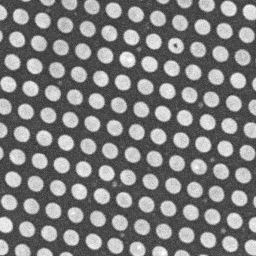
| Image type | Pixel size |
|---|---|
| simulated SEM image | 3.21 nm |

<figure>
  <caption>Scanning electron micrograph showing a regular array of raised bodies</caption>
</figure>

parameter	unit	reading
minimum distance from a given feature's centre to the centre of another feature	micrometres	0.0718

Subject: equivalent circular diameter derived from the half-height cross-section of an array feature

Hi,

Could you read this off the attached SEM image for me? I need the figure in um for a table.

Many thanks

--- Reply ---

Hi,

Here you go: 0.0485